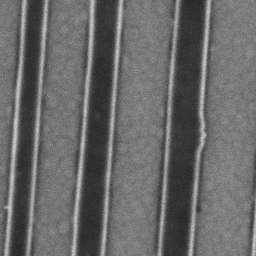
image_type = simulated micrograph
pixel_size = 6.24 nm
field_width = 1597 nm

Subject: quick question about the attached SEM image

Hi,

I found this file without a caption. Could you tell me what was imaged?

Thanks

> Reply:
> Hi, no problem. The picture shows one or a few lines or trenches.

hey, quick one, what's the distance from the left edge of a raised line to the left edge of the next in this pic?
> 78.7 px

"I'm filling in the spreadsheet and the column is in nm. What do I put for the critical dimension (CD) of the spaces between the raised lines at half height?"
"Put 338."